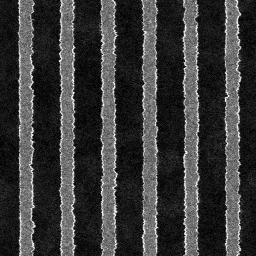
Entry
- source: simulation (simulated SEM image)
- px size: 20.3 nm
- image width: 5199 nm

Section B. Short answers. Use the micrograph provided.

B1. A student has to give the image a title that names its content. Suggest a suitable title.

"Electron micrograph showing parallel lines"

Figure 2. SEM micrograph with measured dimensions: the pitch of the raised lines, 839 nanometres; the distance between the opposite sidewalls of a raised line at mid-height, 262 nm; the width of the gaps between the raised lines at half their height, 576 nm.